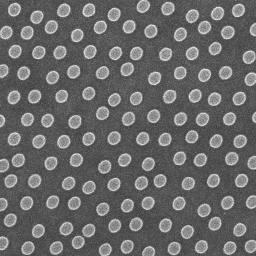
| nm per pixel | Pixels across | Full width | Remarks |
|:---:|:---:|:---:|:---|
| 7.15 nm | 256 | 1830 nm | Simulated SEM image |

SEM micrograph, a regular array of raised bodies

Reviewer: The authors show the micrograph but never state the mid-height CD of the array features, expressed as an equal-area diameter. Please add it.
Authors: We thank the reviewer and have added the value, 88.8 nm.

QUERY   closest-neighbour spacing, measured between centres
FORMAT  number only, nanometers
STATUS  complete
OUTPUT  148